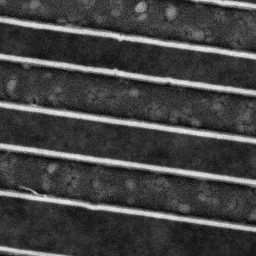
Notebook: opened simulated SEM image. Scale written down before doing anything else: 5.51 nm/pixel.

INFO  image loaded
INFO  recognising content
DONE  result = one or a few lines or trenches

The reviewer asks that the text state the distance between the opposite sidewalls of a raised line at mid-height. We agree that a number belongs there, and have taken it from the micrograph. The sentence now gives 40.7 px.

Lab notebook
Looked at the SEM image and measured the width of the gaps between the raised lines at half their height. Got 264 nm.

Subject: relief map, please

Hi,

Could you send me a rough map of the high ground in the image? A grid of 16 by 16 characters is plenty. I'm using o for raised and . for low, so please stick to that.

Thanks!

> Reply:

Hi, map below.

................
oo..............
ooooooooo.......
oooooooooooooooo
.......ooooooooo
..............oo
................
ooooooo.........
oooooooooooooo..
...ooooooooooooo
..........oooooo
................
ooo.............
oooooooooo......
oooooooooooooooo
oooooooooooooooo